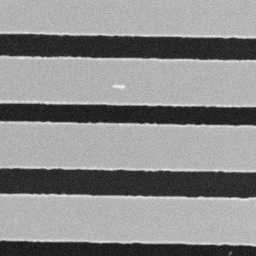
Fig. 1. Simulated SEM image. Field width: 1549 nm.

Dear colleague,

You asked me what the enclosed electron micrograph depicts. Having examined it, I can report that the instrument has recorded lines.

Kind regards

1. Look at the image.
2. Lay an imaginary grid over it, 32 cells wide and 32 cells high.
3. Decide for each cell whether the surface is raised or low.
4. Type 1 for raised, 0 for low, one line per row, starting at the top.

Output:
11111111111111111111111111111111
11111111111111111111111111111111
11111111111111111111111111111111
11111111111111111111111111111111
00000000000000111111111111111111
00000000000000000000000000000000
00000000000000000000000000000000
11111111111111111111111110000000
11111111111111111111111111111111
11111111111111111111111111111111
11111111111111111111111111111111
11111111111111111111111111111111
11111111111111111111111111111111
00000000000000000000000000000000
00000000000000000000000000000000
11111111111111111111000000000000
11111111111111111111111111111111
11111111111111111111111111111111
11111111111111111111111111111111
11111111111111111111111111111111
11111111111111111111111111111111
00000000000000000000000000000000
00000000000000000000000000000000
00000000000000000000000000000000
11111111111100000000000000000000
11111111111111111111111111111111
11111111111111111111111111111111
11111111111111111111111111111111
11111111111111111111111111111111
11111111111111111111111111111111
00000000000000000000000111111111
00000000000000000000000000000000